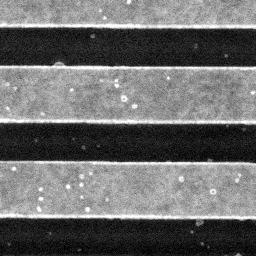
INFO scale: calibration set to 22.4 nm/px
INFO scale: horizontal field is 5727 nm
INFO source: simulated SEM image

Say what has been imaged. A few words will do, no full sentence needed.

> lines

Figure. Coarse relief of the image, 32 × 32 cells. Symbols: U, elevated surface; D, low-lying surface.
UUUUUUUUUUUUUUUUUUUUUUUUUUUUUUUU
UUUUUUUUUUUUUUUUUUUUUUUUUUUUUUUU
UUUUUUUUUUUUUUUUUUUUUUUUUUUUUUUU
DDDDDDDDDDDDDDDDDDDDDDDDDDDDDDDD
DDDDDDDDDDDDDDDDDDDDDDDDDDDDDDDD
DDDDDDDDDDDDDDDDDDDDDDDDDDDDDDDD
DDDDDDDDDDDDDDDDDDDDDDDDDDDDDDDD
DDDDDDDDDDDDDDDDDDDDDDDDDDDDDDDD
UUUUUUUUUUUUUUUUUUUUUUUUUUUUUUUU
UUUUUUUUUUUUUUUUUUUUUUUUUUUUUUUU
UUUUUUUUUUUUUUUUUUUUUUUUUUUUUUUU
UUUUUUUUUUUUUUUUUUUUUUUUUUUUUUUU
UUUUUUUUUUUUUUUUUUUUUUUUUUUUUUUU
UUUUUUUUUUUUUUUUUUUUUUUUUUUUUUUU
UUUUUUUUUUUUUUUUUUUUUUUUUUUUUUUU
DDDDDDDDDDDDDDDDDDDDDDDDDDDDDDDD
DDDDDDDDDDDDDDDDDDDDDDDDDDDDDDDD
DDDDDDDDDDDDDDDDDDDDDDDDDDDDDDDD
DDDDDDDDDDDDDDDDDDDDDDDDDDDDDDDD
DDDDDDDDDDDDDDDDDDDDDDDDDDDDDDDD
UUUUUUUUUUUUUUUUUUUUUUUUUUUUUUUU
UUUUUUUUUUUUUUUUUUUUUUUUUUUUUUUU
UUUUUUUUUUUUUUUUUUUUUUUUUUUUUUUU
UUUUUUUUUUUUUUUUUUUUUUUUUUUUUUUU
UUUUUUUUUUUUUUUUUUUUUUUUUUUUUUUU
UUUUUUUUUUUUUUUUUUUUUUUUUUUUUUUU
UUUUUUUUUUUUUUUUUUUUUUUUUUUUUUUU
DDDDDDDDDDDDDDDDDDDDDDDDDDDDDDDD
DDDDDDDDDDDDDDDDDDDDDDDDDDDDDDDD
DDDDDDDDDDDDDDDDDDDDDDDDDDDDDDDD
DDDDDDDDDDDDDDDDDDDDDDDDDDDDDDDD
DDDDDDDDDDDDDDDDDDDDDDDDDDDDDDDD